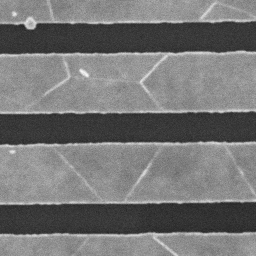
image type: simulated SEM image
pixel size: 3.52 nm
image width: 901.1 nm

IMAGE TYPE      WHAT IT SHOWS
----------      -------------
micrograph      lines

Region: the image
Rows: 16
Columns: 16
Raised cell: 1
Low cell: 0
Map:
1111111111111111
0110000000000000
0000000000000000
1111111111111111
1111111111111111
1111111111111111
1111111111111111
0000000000000000
0000000000000000
1111111111111111
1111111111111111
1111111111111111
1111111111111111
0000000000000000
0000000000000000
1111111111111111